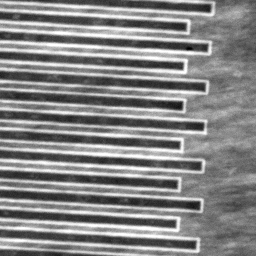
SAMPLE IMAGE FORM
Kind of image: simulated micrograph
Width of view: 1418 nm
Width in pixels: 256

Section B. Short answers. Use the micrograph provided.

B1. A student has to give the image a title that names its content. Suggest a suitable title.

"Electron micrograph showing parallel lines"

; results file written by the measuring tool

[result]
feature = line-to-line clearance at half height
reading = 64.9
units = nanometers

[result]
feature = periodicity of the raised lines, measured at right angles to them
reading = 109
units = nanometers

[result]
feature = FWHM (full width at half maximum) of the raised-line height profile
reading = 46.3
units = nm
